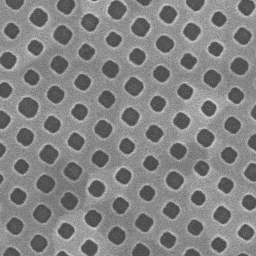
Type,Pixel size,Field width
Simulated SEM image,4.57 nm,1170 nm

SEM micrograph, a regular array of holes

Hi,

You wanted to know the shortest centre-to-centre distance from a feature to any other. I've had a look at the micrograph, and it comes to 134 nm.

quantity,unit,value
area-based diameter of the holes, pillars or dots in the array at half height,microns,0.0771